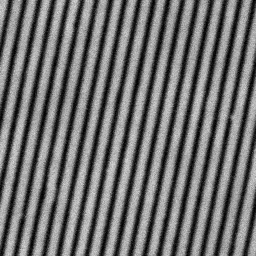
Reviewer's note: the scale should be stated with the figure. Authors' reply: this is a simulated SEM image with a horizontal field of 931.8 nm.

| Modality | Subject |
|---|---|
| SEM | parallel lines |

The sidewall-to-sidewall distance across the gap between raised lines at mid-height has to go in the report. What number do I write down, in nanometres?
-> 17.8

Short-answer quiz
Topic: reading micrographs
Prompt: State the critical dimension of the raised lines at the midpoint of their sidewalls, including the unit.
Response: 31.7 nm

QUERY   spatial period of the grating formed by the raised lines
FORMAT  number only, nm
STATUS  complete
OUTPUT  51.1